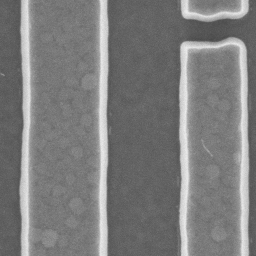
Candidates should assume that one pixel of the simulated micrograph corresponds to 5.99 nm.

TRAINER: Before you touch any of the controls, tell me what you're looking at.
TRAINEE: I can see one or a few lines or trenches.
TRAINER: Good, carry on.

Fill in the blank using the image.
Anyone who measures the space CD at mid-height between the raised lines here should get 471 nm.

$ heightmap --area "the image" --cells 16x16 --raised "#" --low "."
..####......###.
..#####.........
..#####.........
..#####....####.
..#####....####.
..####.....####.
..####.....####.
..####.....####.
..#####....####.
..#####....####.
.######.....###.
.#####......###.
.#####.....####.
..####.....####.
..#####....####.
..####......###.